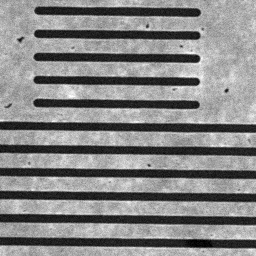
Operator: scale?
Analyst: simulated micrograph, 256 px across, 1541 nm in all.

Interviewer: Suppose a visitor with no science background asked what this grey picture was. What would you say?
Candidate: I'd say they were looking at groups of lines, slits or small figures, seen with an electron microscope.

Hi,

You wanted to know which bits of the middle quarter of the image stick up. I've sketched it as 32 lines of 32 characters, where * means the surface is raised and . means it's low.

********************************
**********************..********
*****************************.**
................................
................................
*******************.............
*.*************************..***
********************************
********************************
................................
................................
***************************.....
******************************.*
******************************.*
.........***********************
................................
................................
********************************
********************************
************************.*******
.........................****...
................................
................................
********************************
********************************
*********************.**********
................................
................................
************....................
********.**.********************
***************.****************
********************************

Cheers